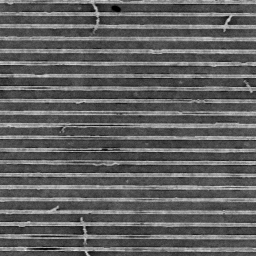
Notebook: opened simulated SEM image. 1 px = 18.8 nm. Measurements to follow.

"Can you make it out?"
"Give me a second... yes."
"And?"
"parallel lines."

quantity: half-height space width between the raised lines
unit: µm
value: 0.165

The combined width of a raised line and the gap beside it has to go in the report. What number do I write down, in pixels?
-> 12.4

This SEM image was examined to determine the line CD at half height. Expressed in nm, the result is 70.6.